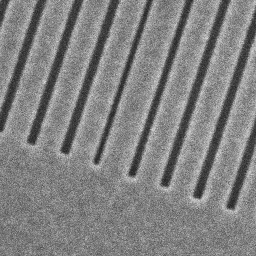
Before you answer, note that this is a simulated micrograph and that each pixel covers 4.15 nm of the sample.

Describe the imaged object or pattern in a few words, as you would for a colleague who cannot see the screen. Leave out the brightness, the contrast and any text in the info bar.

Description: parallel lines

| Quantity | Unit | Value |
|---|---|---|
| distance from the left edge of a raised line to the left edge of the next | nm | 145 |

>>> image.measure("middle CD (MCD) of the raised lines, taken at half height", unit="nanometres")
102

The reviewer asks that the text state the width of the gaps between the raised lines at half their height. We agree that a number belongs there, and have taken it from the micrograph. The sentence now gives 9.98 px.